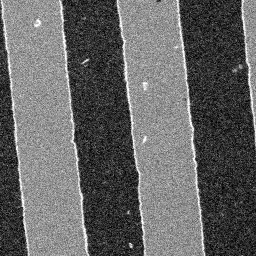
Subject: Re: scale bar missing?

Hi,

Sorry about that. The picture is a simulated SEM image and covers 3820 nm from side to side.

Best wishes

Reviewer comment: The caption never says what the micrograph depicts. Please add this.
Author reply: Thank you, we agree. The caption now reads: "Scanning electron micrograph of one or a few lines or trenches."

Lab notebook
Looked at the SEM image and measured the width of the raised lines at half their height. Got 866 nm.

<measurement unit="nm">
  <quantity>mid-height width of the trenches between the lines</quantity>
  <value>864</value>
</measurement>